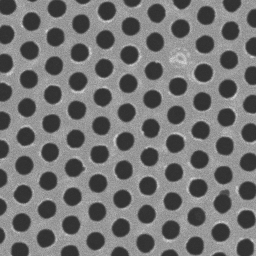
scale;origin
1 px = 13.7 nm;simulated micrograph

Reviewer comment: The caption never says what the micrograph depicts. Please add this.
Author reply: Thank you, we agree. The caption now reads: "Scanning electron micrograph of a regular array of holes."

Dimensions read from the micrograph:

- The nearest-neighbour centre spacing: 391 nanometers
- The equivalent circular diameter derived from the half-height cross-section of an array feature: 0.254 µm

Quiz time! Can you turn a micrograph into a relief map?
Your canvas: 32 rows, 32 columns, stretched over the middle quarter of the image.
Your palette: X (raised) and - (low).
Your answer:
XXXXXXXX----XXXXXXXXX----XXXXXXX
XXXXXXXX----XXXXXXXX-----XXXXXXX
XX---XXX----XXXXXXXX-----XXXXXXX
X-----XXXXXXXX----XXX---XXX--XXX
X-----XXXXXXXX----XXXXXXXX-----X
X-----XXXXXXXX----XXXXXXXX-----X
XX--XXXX---XXX----XXXXXXXX-----X
XXXXXXXX----XXXXXXXX----XXX---XX
XXXXXXX-----XXXXXXXX----XXXXXXXX
XX--XXXX---XXXXXXXXX----XXXXXXXX
X----XXXX-XXXX---XXXX---XXX--XXX
X-----XXXXXXX-----XXXXXXXX----XX
X----XXXXXXXX-----XXXXXXXX----XX
XX--XXXX---XXX---XXXXXXXXX----XX
XXXXXXX----XXXX-XXXX---XXX---XXX
XXXXXXX-----XXXXXXXX----XXXXXXXX
XX--XXX----XXXXXXXXX----XXXXXXXX
X----XXX---XXX---XXX----XXXXXXXX
X----XXXXXXXX----XXXXXXXXX----XX
X----XXXXXXXX-----XXXXXXXX----XX
X---XXXX--XXX----XXXXXXXX-----XX
XXXXXXX----XXX--XXXX---XXX---XXX
XXXXXXX----XXXXXXXX-----XXXXXXXX
XXXXXXX----XXXXXXXX-----XXXXXXXX
X---XXXX--XXXX--XXXX---XXXXXXXXX
-----XXXXXXXX----XXXX-XXXX---XXX
-----XXXXXXXX----XXXXXXXX-----XX
X---XXXX-XXXX----XXXXXXXX-----XX
XXXXXXX---XXXX--XXXX--XXXX---XXX
XXXXXX-----XXXXXXXX----XXXXXXXXX
XXXXXX-----XXXXXXXX----XXXXXXXX-
X---XXX---XXXX-XXXX----XXXXXXXX-